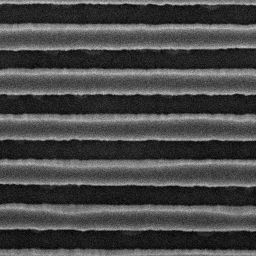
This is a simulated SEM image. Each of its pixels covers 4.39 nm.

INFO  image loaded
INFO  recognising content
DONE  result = lines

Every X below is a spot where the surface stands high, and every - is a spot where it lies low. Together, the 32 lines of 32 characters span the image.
-------------------XXXXXX-X---XX
--------------------------------
--------------------------------
XXXXXXXXXXXXXXXXXXXXXXXXXXXXXXXX
XXXXXXXXXXXXXXXXXXXXXXXXXXXXXXXX
XXXXXXXXXXXXXXXXXXXXXXXXXXXXXXXX
--------------------------------
--------------------------------
--------------------------------
XXXXXXXXXXXXXXXXXXXXXXXXXXXXXXXX
XXXXXXXXXXXXXXXXXXXXXXXXXXXXXXXX
XXXXXXXXXXXXXXXXXXXXXXXXXXXXXXXX
--------------------------------
--------------------------------
-------------------------X------
XXXXXXXXXXXXXXXXXXXXXXXXXXXXXXXX
XXXXXXXXXXXXXXXXXXXXXXXXXXXXXXXX
----XX-X----XXXXXXXXXXXXXXXXXXXX
--------------------------------
--------------------------------
XXXXXXXXXXXXXXXXXXXXXXXXXXXXXXXX
XXXXXXXXXXXXXXXXXXXXXXXXXXXXXXXX
XXXXXXXXXXXXXXXXXXXXXXXXXXXXXXXX
--------------------------------
--------------------------------
--------------------------------
XXXXXXXXXXXXXXXXXXXXXXXXXXXXXXXX
XXXXXXXXXXXXXXXXXXXXXXXXXXXXXXXX
XXXXXXXXXXXXXXXXXXXXXXXXXXXXXXXX
--------------------------------
--------------------------------
XXXXX--XXXX-----XXXXXXXXXXXXXXX-